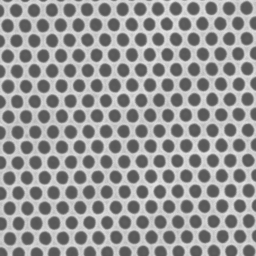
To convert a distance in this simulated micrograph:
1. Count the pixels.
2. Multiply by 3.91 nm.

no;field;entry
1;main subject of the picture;a regular array of holes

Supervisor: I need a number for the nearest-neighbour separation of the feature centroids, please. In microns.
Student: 0.0679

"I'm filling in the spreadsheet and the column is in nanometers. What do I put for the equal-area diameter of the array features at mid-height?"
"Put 49.3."